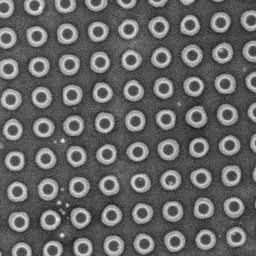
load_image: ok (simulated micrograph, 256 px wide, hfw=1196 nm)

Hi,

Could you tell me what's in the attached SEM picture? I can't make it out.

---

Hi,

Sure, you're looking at an array of small figures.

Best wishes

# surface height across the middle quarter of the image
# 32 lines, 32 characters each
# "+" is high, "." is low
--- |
++++...++++....++++....+++.....+
+++....++++.....................
++..............................
...............................+
................++.....++++...++
.++.....+++....++++....++++...++
++++...+++++...+++++..+++++...++
+++++..+++++...+++++...++++....+
++++...+++++....+++......+......
++++.....++.....................
................................
...............................+
.........+++....++++...+++++...+
.+++....++++...+++++...+++++..++
+++++...+++++..+++++...+++++...+
+++++...++++....++++....+++.....
+++++...++++....+++.............
.+++............................
................................
........................++++....
..........++....+++++...+++++..+
.++++....++++...+++++...+++++..+
.++++...+++++...+++++...+++++...
.+++++..+++++...++++.....+++....
.++++....+++....................
..++............................
................................
...................+.....++++...
...++.....+++....++++...+++++...
..++++...++++....+++++..+++++...
.+++++...+++++...+++++...++++...
.+++++...+++++....+++...........